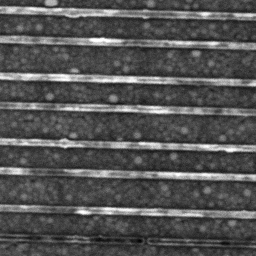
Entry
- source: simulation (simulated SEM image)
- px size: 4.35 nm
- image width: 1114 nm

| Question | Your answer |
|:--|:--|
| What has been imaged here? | parallel lines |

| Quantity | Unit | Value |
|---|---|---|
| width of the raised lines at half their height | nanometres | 27.2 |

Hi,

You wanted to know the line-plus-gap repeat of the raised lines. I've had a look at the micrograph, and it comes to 141 nanometers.